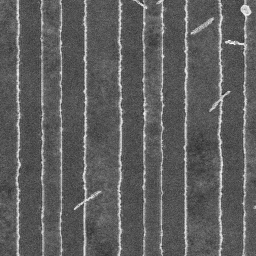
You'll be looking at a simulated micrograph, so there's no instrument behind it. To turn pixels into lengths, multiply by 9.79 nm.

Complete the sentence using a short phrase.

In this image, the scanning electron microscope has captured lines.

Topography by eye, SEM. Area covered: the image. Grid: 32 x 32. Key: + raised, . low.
++...+++...++++...++...+++++..++
++...+++...++++...++...+++++..++
++...+++...++++...++...+++++...+
++...+++...++++...++...+++++...+
++...+++...++++...++...+++++...+
++...+++...++++...++...+++++..++
++...+++...++++...++...+++++...+
++...+++...++++...++...++++....+
++...+++...++++...++...+++++...+
++...+++...++++...++...+++++...+
++...+++...++++...++...+++++...+
++...+++...++++...++...+++++...+
++...+++...++++...++...+++++...+
++...+++...++++...++...+++++...+
++...+++...++++...++...+++++...+
++...+++...++++...++...+++++...+
++...+++...++++...++...++++...++
++...+++...++++...++...+++++...+
++...+++...++++...++...+++++...+
++...+++...++++...++...+++++...+
++...+++...++++...++...+++++...+
++...+++..+++++...++...+++++...+
++...+++..+++++...++...+++++...+
++...+++...++++...++...+++++...+
++...+++...++++...++...+++++...+
++...+++..+++++...++...++++...++
++...+++...++++...++...+++++...+
++...+++...++++...++...+++++...+
++...+++...++++...++...+++++...+
++...+++...++++...++...+++++...+
++...+++...++++...++...+++++...+
++...+++...++++...++...+++++..++